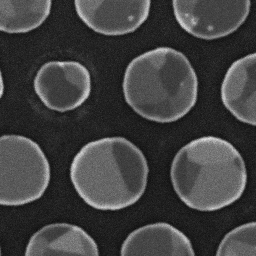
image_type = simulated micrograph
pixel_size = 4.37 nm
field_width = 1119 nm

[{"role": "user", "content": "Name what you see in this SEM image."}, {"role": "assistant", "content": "raised bodies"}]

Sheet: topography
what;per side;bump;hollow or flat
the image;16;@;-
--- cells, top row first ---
@@@--@@@@--@@@@-
@@----@@@--@@@@-
----------------
---------@@-----
---@@---@@@@--@@
--@@@---@@@@--@@
---@@---@@@@--@@
----------@----@
----------------
@@@--@@@@--@@@@-
@@@--@@@@--@@@@-
@@@--@@@@--@@@@-
@@---@@@----@@@-
----------------
--@@@----@@----@
--@@@@--@@@@--@@